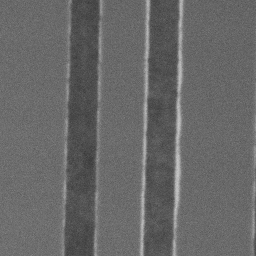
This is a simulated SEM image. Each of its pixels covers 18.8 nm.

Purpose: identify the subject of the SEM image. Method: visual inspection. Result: lines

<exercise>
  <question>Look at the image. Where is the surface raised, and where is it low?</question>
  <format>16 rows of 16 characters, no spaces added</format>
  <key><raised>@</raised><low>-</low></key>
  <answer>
@@@@--@@@--@@@@@
@@@@--@@@--@@@@@
@@@@--@@@--@@@@@
@@@@--@@@--@@@@@
@@@@--@@@--@@@@@
@@@@--@@@--@@@@@
@@@@--@@@--@@@@@
@@@@--@@@--@@@@@
@@@@--@@@--@@@@@
@@@@--@@@--@@@@@
@@@@--@@@--@@@@@
@@@@--@@@--@@@@@
@@@@--@@@--@@@@@
@@@@--@@@--@@@@@
@@@@--@@@--@@@@@
@@@@--@@@--@@@@@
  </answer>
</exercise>